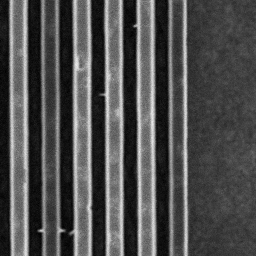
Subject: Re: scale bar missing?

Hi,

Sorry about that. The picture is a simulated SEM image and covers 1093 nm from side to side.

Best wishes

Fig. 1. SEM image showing parallel lines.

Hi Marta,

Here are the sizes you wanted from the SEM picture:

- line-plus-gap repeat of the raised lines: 136 nm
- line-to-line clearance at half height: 67.8 nanometres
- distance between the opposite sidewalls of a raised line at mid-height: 67.8 nanometres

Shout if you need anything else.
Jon